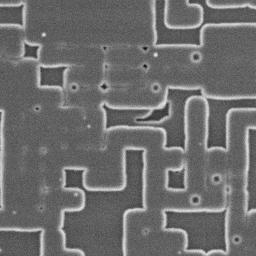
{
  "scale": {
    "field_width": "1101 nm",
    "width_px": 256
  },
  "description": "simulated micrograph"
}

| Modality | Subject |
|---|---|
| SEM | wiring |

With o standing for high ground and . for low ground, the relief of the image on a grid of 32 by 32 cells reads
ooooooooooooooooooo..ooo..oooooo
...oooooooooooooooo..oooo.......
...oooooooooooooooo..oooo.......
ooooooooooooooooooo..ooo.ooooooo
oooooooooooooooooooo.....ooooooo
oooooooooooooooooooo.....ooooooo
ooo..ooooooooooooooooooooooooooo
oooooooooooooooooooooooooooooooo
ooooo...oooooooooooooooooooooooo
ooooo...oooooooooooooooooooooooo
ooooo...oooooooooooooooooooooooo
ooooooooooooooooooooo....ooooooo
ooooooooooooooooooooo...oo......
ooooooooooooo.oooooo...ooo......
ooooooooooooo..........ooo..oooo
ooooooooooooo..........ooo..oooo
ooooooooooooooooooooo..ooo..ooo.
ooooooooooooooooooooo..ooo..ooo.
ooooooooooooooooooooooooooooooo.
oooooooooooooooo..ooooooooooooo.
oooooooooooooooo..ooooooooooooo.
oooooooo..oooooo..ooo..oooooooo.
oooooooo..oooooo..ooo..oooooooo.
ooooooooo..oooo...ooo..oooooooo.
ooooooooooo.......ooooooooooooo.
ooooooooooo.......ooooooooooooo.
oooooooo........ooooo.......oooo
oooooooo........ooooo.......oooo
oooooooo........ooooo.......oooo
.....ooo........ooooooo.....oooo
.....ooo........ooooooo.....oooo
.....ooooo......oooooooooooooooo